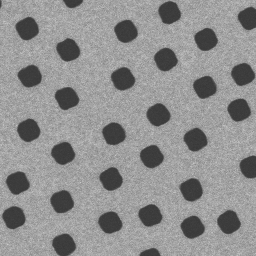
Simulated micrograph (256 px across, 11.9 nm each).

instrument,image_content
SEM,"a regular array of holes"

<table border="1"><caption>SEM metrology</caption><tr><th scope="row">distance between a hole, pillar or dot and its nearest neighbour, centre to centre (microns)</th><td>0.503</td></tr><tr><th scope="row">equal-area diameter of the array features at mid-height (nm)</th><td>263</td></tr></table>